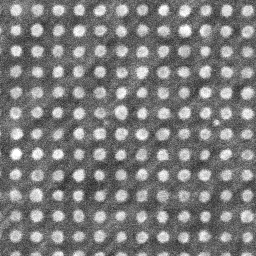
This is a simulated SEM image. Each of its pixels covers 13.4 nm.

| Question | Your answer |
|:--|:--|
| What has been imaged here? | a regular array of raised bodies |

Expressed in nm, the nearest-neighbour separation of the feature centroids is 272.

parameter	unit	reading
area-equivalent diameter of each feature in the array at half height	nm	132